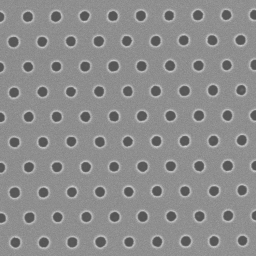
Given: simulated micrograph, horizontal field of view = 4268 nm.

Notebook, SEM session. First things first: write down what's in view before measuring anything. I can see a regular array of holes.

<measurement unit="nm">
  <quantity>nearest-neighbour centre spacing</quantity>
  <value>470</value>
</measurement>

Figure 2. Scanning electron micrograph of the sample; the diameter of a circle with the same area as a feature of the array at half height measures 173 nm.